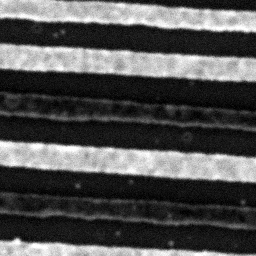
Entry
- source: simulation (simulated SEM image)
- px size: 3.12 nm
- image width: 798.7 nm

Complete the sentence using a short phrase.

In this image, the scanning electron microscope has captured lines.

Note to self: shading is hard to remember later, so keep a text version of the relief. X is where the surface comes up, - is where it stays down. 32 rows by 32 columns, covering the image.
XXXXXXXXXXXXXX------------------
XXXXXXXXXXXXXXXXXXXXXXXXXXXXXX--
----XXXXXXXXXXXXXXXXXXXXXXXXXXXX
------------------------XXXXXXXX
--------------------------------
--------------------------------
XXXXXXXXXXXXXXXX----------------
XXXXXXXXXXXXXXXXXXXXXXXXXXXXXXXX
-XXXXXXXXXXXXXXXXXXXXXXXXXXXXXXX
----------------------XXXXXXXXXX
--------------------------------
--------------------------------
XXXXXXXXXXXX--------------------
XXXXXXXXXXXXXXXXXXXXXXXX--------
----XXXXXXXXXXXXXXXXXXXXXXXXXXXX
---------------------XXXXXXXXXXX
--------------------------------
--------------------------------
XXXXXXXXXXXX--------------------
XXXXXXXXXXXXXXXXXXXXXXXXXXXXX---
XXXXXXXXXXXXXXXXXXXXXXXXXXXXXXXX
-------------XXXXXXXXXXXXXXXXXXX
----------------------------XXXX
--------------------------------
XXXXX---------------------------
XXXXXXXXXXXXXXXXXXXXXX----------
XXXXXXXXXXXXXXXXXXXXXXXXXXXXXXXX
----------------XXXXXXXXXXXXXXXX
------------------------------XX
--------------------------------
XXXX----------------------------
XXXXXXXXXXXXXXXXXXXXXXXX--------